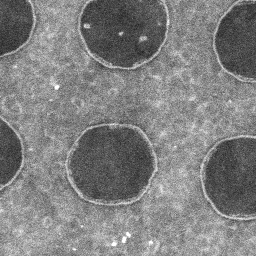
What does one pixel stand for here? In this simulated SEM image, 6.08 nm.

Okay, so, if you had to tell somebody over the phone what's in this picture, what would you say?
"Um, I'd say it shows raised bodies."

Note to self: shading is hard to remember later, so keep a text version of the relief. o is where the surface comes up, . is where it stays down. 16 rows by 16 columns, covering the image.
oo...ooooo....oo
oo...ooooo....oo
oo...ooooo...ooo
......oooo....oo
..............oo
................
................
................
o....oooo.......
o...oooooo...ooo
o...oooooo...ooo
....ooooo....ooo
......oo.....ooo
..............oo
................
................